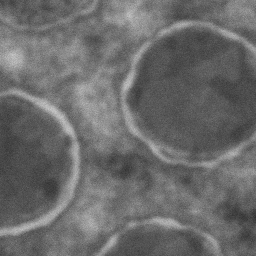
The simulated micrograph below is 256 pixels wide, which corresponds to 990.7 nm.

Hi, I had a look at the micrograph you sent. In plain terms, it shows raised bodies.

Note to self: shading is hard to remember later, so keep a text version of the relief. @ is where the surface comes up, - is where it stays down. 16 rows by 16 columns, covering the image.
----------------
------------@---
----------@@@@@-
---------@@@@@@@
--------@@@@@@@@
--------@@@@@@@@
@@@-----@@@@@@@@
@@@@----@@@@@@@@
@@@@@----@@@@@@@
@@@@@-----@@@@@-
@@@@@-----------
@@@@@-----------
@@@@------------
@@@-------------
-------@@@@@@---
-------@@@@@@@--